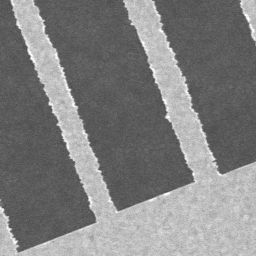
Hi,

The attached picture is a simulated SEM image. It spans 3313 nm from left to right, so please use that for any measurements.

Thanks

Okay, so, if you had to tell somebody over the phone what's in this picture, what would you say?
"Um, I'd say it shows one or a few lines or trenches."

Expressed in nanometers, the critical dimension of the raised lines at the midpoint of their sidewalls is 305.